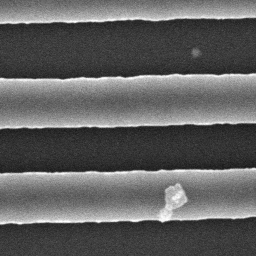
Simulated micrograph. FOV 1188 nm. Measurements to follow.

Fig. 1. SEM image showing lines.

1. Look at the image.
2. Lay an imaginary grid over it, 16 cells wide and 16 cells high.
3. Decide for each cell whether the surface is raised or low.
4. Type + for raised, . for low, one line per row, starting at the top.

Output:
++++++++++++++++
................
................
................
................
++++++++++++++++
++++++++++++++++
++++++++++++++++
................
................
................
++++++++++++++++
++++++++++++++++
++++++++++++++++
................
................